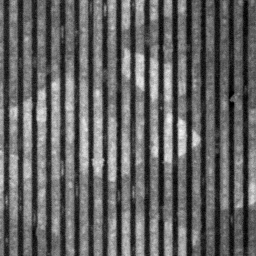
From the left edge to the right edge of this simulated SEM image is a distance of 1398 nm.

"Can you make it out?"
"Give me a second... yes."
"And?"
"parallel lines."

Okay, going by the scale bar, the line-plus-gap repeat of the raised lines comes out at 0.0768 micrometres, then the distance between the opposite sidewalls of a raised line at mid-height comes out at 43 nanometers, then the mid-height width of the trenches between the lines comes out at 33.4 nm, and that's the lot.